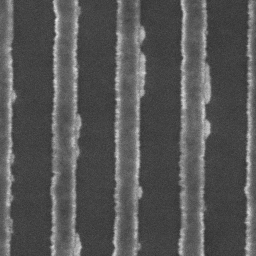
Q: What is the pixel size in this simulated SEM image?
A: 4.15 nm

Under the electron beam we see lines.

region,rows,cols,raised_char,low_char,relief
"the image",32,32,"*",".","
*......***.....**......***.....*
*......***.....**......***.....*
*......***.....**......***.....*
*......***.....**......***.....*
*......**......***.....***.....*
*......**......**......***.....*
*......**......***.....***.....*
*......**......***.....***.....*
*......**......***.....***.....*
**.....***.....***.....***.....*
**.....***.....***.....***.....*
**.....**......***.....***.....*
**.....***.....**......***.....*
*......**......**......**......*
*......***.....**......***.....*
*......***.....**......***.....*
*......**......**......***.....*
*......**.....***......**......*
*......**......**......**......*
*......**......**......**......*
*......**......**......**......*
*......**......**......**......*
*......**......**......**......*
*......**......**......**......*
*......**.....***......**......*
*......**......**......**......*
*......**......**......**......*
*......**.....***......**......*
*......**.....***......**......*
*......**.....***......**......*
*......***....***......**......*
*......***....***......**......*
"